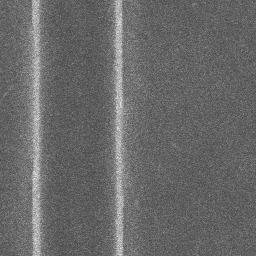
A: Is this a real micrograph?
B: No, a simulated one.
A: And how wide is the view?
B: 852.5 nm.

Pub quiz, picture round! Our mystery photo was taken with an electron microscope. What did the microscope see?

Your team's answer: one or a few lines or trenches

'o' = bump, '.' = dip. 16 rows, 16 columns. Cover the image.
oo.....ooooooooo
oo.....ooooooooo
oo.....ooooooooo
oo.....ooooooooo
oo.....ooooooooo
oo.....ooooooooo
oo.....ooooooooo
oo.....ooooooooo
oo.....ooooooooo
oo.....ooooooooo
oo.....ooooooooo
oo.....ooooooooo
oo.....ooooooooo
oo.....ooooooooo
oo.....ooooooooo
oo.....ooooooooo